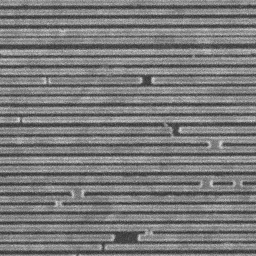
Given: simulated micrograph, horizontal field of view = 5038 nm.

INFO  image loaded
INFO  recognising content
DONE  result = parallel lines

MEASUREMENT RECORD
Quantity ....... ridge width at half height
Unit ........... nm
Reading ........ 91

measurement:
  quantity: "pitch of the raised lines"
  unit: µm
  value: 0.193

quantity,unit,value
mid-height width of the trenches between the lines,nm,111